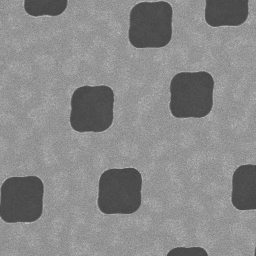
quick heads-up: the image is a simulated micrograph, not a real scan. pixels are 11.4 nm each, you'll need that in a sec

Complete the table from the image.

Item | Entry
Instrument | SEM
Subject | holes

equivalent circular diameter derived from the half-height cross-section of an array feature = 48.4 px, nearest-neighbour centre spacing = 957 nanometres